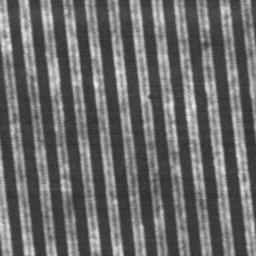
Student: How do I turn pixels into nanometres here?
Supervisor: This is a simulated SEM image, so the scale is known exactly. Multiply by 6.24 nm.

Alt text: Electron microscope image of parallel lines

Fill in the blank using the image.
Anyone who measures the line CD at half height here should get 0.0489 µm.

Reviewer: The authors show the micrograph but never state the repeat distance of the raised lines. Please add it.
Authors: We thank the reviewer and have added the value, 138 nm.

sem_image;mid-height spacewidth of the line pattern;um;0.0922